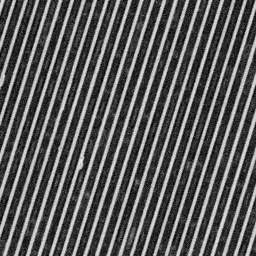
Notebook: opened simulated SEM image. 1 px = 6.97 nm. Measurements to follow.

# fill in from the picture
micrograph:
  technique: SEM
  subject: parallel lines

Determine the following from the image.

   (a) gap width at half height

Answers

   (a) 59.1 nm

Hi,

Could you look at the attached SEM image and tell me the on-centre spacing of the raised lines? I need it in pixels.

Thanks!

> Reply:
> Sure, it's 11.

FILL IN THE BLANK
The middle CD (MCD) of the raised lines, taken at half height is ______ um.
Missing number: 0.02